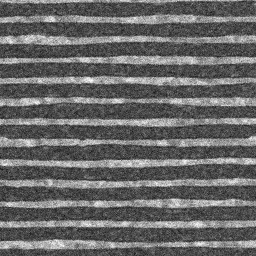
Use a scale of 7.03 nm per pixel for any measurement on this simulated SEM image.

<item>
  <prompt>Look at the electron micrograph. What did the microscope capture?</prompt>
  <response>parallel lines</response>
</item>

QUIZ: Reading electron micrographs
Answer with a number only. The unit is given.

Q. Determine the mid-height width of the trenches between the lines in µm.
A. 0.104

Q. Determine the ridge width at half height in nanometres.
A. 38.7